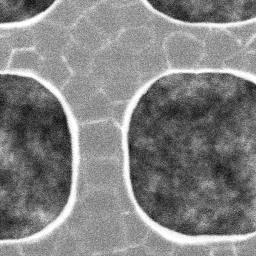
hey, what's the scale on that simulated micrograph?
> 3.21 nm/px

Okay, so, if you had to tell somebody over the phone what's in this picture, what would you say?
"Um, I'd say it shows holes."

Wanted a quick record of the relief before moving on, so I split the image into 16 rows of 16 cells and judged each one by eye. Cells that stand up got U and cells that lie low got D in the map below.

DDDUUUUUUUDDDDDD
DUUUUUUUUUUUUUUU
UUUUUUUUUUUUUUUU
UUUUUUUUUUUUUUUU
UUUUUUUUUUUUUDUU
DDDUUUUUUDDDDDDD
DDDDUUUUDDDDDDDD
DDDDUUUUDDDDDDDD
DDDDDUUUDDDDDDDD
DDDDDUUUDDDDDDDD
DDDDDUUUDDDDDDDD
DDDDDUUUDDDDDDDD
DDDDUUUUDDDDDDDD
DDDDUUUUUDDDDDDD
DDDUUUUUUUDDDDDD
UUUUUUUUUUUUUUUU